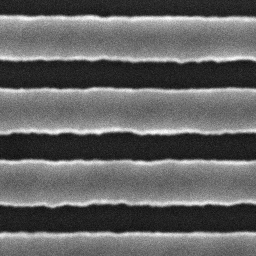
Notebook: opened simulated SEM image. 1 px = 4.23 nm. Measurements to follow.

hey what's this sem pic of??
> lines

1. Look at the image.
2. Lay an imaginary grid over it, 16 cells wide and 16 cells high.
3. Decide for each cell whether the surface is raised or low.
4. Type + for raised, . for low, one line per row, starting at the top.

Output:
................
++++++++++++++++
++++++++++++++++
++++++++++++++++
................
......+.......+.
++++++++++++++++
++++++++++++++++
................
................
++++++++++++++++
++++++++++++++++
++++++++++++++++
................
................
++++++++++++++++